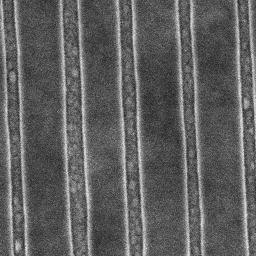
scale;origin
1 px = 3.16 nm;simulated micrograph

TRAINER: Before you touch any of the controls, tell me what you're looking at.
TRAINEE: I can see parallel lines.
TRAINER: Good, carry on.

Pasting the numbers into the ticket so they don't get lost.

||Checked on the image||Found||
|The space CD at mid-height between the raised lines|39.4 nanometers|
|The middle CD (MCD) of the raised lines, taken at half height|146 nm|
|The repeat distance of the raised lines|185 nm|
